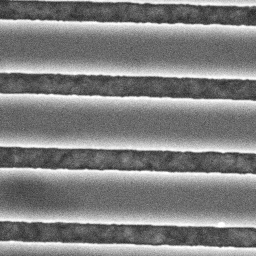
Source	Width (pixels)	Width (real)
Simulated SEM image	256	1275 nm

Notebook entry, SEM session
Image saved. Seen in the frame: lines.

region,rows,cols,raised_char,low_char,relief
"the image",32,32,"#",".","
.......................#########
................................
................................
################################
################################
################################
################################
################################
################################
....................############
................................
................................
########################........
################################
################################
################################
################################
################################
............####################
................................
................................
####################............
################################
################################
################################
################################
################################
################################
................................
................................
############....................
################################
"